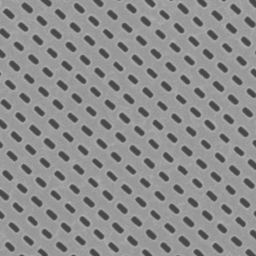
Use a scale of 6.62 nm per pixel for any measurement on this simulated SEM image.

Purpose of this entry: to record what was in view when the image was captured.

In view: a regular array of holes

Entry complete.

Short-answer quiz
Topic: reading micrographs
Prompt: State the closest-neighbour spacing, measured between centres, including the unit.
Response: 128 nanometers